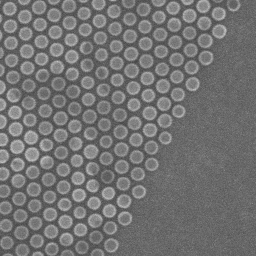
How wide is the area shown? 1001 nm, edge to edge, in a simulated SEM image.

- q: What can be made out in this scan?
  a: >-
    a regular array of raised bodies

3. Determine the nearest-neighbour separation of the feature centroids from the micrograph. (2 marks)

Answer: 65.6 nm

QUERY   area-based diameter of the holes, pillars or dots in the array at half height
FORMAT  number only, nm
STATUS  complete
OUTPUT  48.6